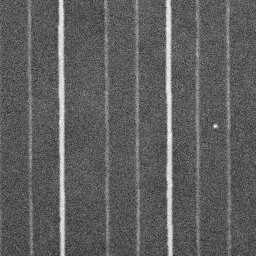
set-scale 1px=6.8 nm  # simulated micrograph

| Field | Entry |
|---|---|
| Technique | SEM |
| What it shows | lines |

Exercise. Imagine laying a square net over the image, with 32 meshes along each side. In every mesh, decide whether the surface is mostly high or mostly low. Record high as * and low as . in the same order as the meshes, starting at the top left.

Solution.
****.........****........***....
****.........****........****...
****.........****........***....
****.........****........***....
****.........****........***....
****.........****........****...
****.........****........****...
****.........****........****...
****.........****........****...
****...*.....****........****...
****...*.....****........****...
****...*.....****........****...
****...*.....****........****...
****.........****........****...
****.........****........****...
****.........****........****...
****.........****........****...
****.........****........****...
****.........****........****...
****.........****........****...
****.........****........****...
****.........****........****...
****.........****........****...
****.........****........****...
****.........****........****...
****.........****........****...
****.........****........****...
****.........****........****...
****.........****........****...
****.........****........****...
****.........****........****...
****.........****........****...